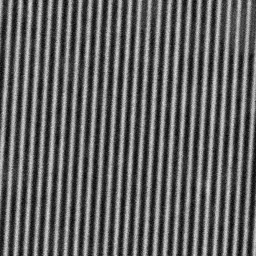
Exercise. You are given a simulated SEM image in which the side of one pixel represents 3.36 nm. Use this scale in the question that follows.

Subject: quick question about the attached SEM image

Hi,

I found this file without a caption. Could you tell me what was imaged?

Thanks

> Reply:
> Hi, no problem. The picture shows parallel lines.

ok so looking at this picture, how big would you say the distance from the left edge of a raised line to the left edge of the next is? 9.94 pixels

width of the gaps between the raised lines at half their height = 6.88 px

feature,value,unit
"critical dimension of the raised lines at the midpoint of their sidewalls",8.8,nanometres